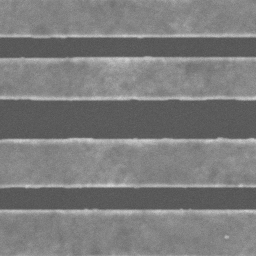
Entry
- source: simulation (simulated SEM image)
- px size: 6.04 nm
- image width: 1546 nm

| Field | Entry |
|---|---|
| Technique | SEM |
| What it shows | lines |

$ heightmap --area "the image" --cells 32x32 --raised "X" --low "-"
XXXXXXXXXXXXXXXXXXXXXXXXXXXXXXXX
XXXXXXXXXXXXXXXXXXXXXXXXXXXXXXXX
XXXXXXXXXXXXXXXXXXXXXXXXXXXXXXXX
XXXXXXXXXXXXXXXXXXXXXXXXXXXXXXXX
XXXXXXXXXXXXXXXXXXXXXXXXXX-X--XX
--------------------------------
--------------------------------
XXXXXXXXXXXXXXXXXXXXXXXXXXXXXXXX
XXXXXXXXXXXXXXXXXXXXXXXXXXXXXXXX
XXXXXXXXXXXXXXXXXXXXXXXXXXXXXXXX
XXXXXXXXXXXXXXXXXXXXXXXXXXXXXXXX
XXXXXXXXXXXXXXXXXXXXXXXXXXXXXXXX
--------------------------------
--------------------------------
--------------------------------
--------------------------------
--------------------------------
XXXXXXXXXXXX-XXX----XXXXXXXXXXXX
XXXXXXXXXXXXXXXXXXXXXXXXXXXXXXXX
XXXXXXXXXXXXXXXXXXXXXXXXXXXXXXXX
XXXXXXXXXXXXXXXXXXXXXXXXXXXXXXXX
XXXXXXXXXXXXXXXXXXXXXXXXXXXXXXXX
XXXXXXXXXXXXXXXXXXXXXXXXXXXXXXXX
--------------------------------
--------------------------------
--------------------------------
XXXXXXXXXXXXXXXXXXXXXXXXXXXXXXXX
XXXXXXXXXXXXXXXXXXXXXXXXXXXXXXXX
XXXXXXXXXXXXXXXXXXXXXXXXXXXXXXXX
XXXXXXXXXXXXXXXXXXXXXXXXXXXXXXXX
XXXXXXXXXXXXXXXXXXXXXXXXXXXXXXXX
XXXXXXXXXXXXXXXXXXXXXXXXXXXXXXXX